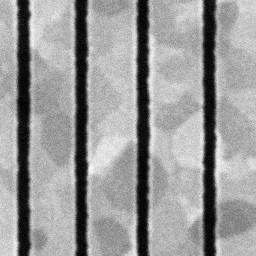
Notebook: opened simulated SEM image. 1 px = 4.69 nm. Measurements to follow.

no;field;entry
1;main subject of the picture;lines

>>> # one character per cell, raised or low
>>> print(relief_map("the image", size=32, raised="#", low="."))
##..#####..######..######..#####
##..#####..######..######..#####
##..#####..######..######..#####
##..#####..######..######..#####
##..#####..######..######..#####
##..#####..######..######..#####
##..#####..######..######..#####
##..#####..######..######..#####
##..#####..######..######..#####
##..#####..######..######..#####
##..#####..######..######..#####
##..#####..######..######..#####
##..#####..######..######..#####
##..#####..######..######..#####
##..#####..######..######..#####
##..#####..######..######..#####
##..#####..######..######..#####
##..#####..######..######..#####
##..#####..######..######..#####
##..#####..######..######..#####
##..#####..######..######..#####
##..#####..######..######..#####
##..#####..######..######..#####
##..#####..######..######..#####
##..#####..######..######..#####
##..#####..######..######..#####
##..#####..######..######..#####
##..#####..######..######..#####
##..#####..######..######..#####
##..#####..######..######..#####
##..#####..######..######..#####
##..#####..######..######..#####